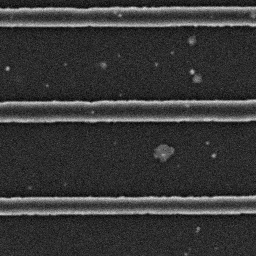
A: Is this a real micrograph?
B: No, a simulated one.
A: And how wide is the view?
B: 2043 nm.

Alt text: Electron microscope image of lines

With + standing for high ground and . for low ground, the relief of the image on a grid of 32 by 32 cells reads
................................
++++++++++++++++++++++++++++++++
++++++++++++++++++++++++++++++++
................................
................................
................................
................................
................................
................................
................................
................................
................................
................................
++++++++++++++++++++++++++++++++
++++++++++++++++++++++++++++++++
................................
................................
................................
................................
................................
................................
................................
................................
................................
................................
++++++++++++++++++++++++++++++++
++++++++++++++++++++++++++++++++
................................
................................
................................
................................
................................